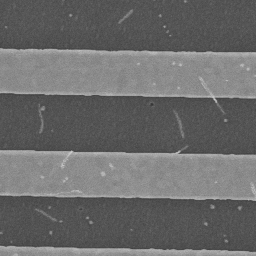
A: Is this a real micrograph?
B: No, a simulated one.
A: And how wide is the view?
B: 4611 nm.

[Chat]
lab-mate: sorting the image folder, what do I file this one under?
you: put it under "lines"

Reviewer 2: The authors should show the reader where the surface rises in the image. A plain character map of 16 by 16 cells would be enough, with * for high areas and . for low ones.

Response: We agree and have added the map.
................
................
................
****************
****************
****************
................
................
................
*****...........
****************
****************
...............*
................
................
**..............